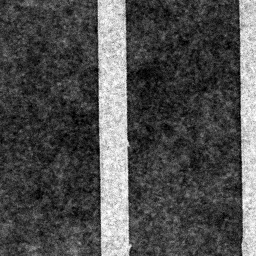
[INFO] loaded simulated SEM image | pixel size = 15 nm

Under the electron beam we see one or a few lines or trenches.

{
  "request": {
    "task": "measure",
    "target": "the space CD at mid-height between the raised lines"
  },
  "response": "1710 nm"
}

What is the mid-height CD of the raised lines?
408 nm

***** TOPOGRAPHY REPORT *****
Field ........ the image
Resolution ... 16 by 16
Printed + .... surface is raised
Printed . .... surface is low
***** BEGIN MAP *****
......++.......+
......++.......+
......++.......+
......++.......+
......++.......+
......++.......+
......++.......+
......++.......+
......++.......+
......++.......+
......++.......+
......++.......+
......++.......+
......++.......+
......++.......+
......++.......+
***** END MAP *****